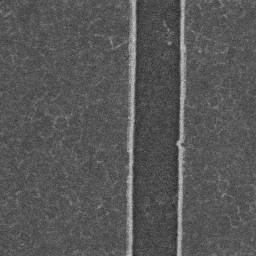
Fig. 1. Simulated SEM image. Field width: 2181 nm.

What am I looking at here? one or a few lines or trenches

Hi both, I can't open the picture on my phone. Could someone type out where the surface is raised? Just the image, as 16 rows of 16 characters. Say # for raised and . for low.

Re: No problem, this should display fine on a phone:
########...#####
########...#####
########...#####
########...#####
########...#####
########...#####
########...#####
########...#####
########...#####
########...#####
########...#####
########...#####
########...#####
########...#####
########...#####
########...#####